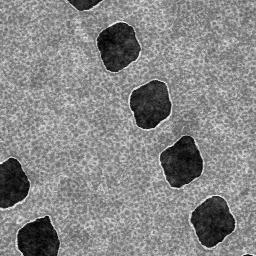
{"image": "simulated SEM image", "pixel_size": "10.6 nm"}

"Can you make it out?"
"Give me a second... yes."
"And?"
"holes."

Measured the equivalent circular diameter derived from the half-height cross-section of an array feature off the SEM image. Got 0.481 microns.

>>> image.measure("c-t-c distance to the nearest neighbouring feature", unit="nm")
703